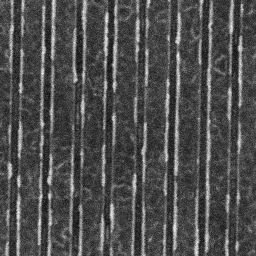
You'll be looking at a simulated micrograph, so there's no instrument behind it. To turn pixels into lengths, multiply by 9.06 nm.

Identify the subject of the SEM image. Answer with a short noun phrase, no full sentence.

parallel lines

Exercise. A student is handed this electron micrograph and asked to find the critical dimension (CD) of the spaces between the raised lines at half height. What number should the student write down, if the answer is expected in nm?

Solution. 67.9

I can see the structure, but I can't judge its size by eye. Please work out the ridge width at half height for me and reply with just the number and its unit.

214 nm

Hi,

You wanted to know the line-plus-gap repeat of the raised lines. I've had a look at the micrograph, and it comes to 0.283 µm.